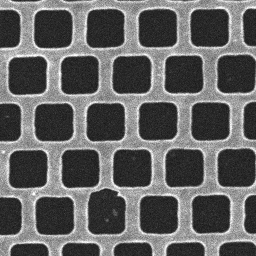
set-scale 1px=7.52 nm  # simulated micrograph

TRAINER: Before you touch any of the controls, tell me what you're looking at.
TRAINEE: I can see a regular array of holes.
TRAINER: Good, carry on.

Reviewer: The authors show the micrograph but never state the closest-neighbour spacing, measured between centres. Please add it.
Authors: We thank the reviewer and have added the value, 391 nanometers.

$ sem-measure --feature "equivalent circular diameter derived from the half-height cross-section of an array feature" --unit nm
318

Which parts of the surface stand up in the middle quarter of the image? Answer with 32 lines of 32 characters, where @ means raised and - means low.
---------@@@----------@@@-------
---------@@@----------@@@-------
---------@@@----------@@@-------
---------@@@----------@@@-------
---------@@@----------@@@-------
---------@@@----------@@@-------
---------@@@---------@@@@-------
@------@@@@@@@------@@@@@@@@@@@@
@@@@@@@@@@@@@@@@@@@@@@@@@@@@@@@@
@@@@@@@@@@@@@@@@@@@@-------@@@@@
--@@@@---------@@@@---------@@@@
--@@@@---------@@@@---------@@@@
--@@@@---------@@@@---------@@@@
--@@@@----------@@@---------@@@@
--@@@@----------@@----------@@@@
--@@@@---------@@@@---------@@@@
--@@@@---------@@@@---------@@@@
--@@@@---------@@@@---------@@@@
--@@@@---------@@@@@-------@@@@@
@@@@@@@-@@@@@@@@@@@@@@@@@@@@@@@@
@@@@@@@@@@@@@@@@@@@@@@@@@@@@@@@@
@-------@@@@@--------@@@@@------
---------@@@@---------@@@-------
---------@@@----------@@@-------
---------@@@----------@@@-------
---------@@@----------@@@-------
---------@@@----------@@@-------
---------@@@----------@@@-------
---------@@@----------@@@-------
---------@@@----------@@@@------
--------@@@@@--------@@@@@------
@@@@@@@@@---@@@@@@@@@@@@@@@@@@@@